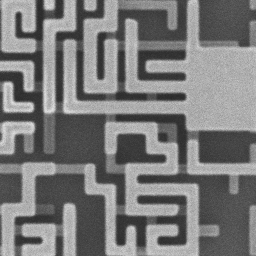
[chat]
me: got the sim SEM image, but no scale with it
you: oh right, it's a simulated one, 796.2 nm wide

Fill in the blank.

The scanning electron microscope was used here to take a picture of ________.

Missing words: wiring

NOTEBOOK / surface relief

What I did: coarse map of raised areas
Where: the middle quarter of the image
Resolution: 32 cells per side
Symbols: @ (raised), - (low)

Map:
@@@--@@@--@@@---@@---@@@@@@@@@@@
@@@--@@@--@@@---@@---@@@@@@@@@@@
@@@--@@@--@@@---@@------------@@
@@@--@@@--@@@---@@-------------@
@@@--@@@@@@@@---@@@@@@@@@@@@@@@@
@@@--@@@@@@@@---@@@@@@@@@@@@@@@@
@@@--@@@@@@@@---@@@@@@@@@@@@@@@@
@@@---------------------------@@
@@@----------------------------@
@@@@@@@@@@@@@@@@@@@@@@@@@@@@@-@@
@@@@@@@@@@@@@@@@@@@@@@@@@@@@@@@@
@@@@@@@@@@@@@@@@@@@@@@@@@@@@@@@@
------------------------------@@
-------------------------------@
-------------------------------@
----------@@@@@@@@@@@@@--------@
----------@@@@@@@@@@@@@---------
----------@@@@------@@@---------
----------@@@--------@@---------
----------@@@--------@@@-------@
----------@@@--------@@@@@@@---@
----------@@@--------@@@@@@@---@
-------------------------@@@---@
--------------------------@@---@
--------------------------@@---@
------@@--------@@@@@@@@@@@@---@
-----@@@--------@@@@@@@@@@@@---@
-----@@@--------@@@---@@@@@@----
-----@@@--------@@--------------
-----@@@--------@@--------------
-----@@@@@@@@---@@@@@@@@@@@@@@@@
-----@@@@@@@@---@@@@@@@@@@@@@@@@